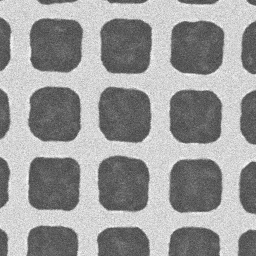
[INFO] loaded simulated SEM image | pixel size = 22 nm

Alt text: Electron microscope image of a regular array of holes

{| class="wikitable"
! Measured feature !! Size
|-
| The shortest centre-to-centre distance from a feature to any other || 1520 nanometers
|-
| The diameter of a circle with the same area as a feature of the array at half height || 1270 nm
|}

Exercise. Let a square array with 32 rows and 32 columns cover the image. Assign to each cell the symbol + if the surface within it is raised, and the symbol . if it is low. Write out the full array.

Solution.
+++++.+++++++++..++++++....++++.
++++++++++++++++++++++++++++++++
.++++....+++++....++++++++++++++
.+++......+++......+++......+++.
.+++......++.......++.......++..
.+++......+++......++.......++..
.+++......+++......++.......++..
.+++......+++......++.......++..
.+++.....++++.....++++.....++++.
++++++++++++++++++++++++++++++++
++++++++++++++++++++++++++++++++
.+++.....++++.....++++.....++++.
.+++......++.......++.......++..
.+++......++.......++.......++..
.+++......++.......++.......++..
.+++......++.......++.......++..
.+++......+++......++.......++..
+++++....++++.....++++.....++++.
++++++++++++++++++++++++++++++++
++++++++++++++..++++++++++++++++
.+++......+++.....++++.....++++.
.+++......++.......++.......++..
.+++......++.......++.......++..
.+++......++.......++.......++..
.++.......++.......++.......++..
.+++......+++.....+++.......++..
++++++++++++++++.+++++....+++++.
++++++++++++++++++++++++++++++++
++++.....+++++...++++++...++++++
.+++......++......+++......+++..
.++.......++.......++.......++..
.++.......++.......++.......++..